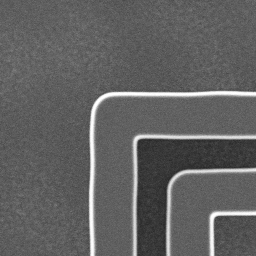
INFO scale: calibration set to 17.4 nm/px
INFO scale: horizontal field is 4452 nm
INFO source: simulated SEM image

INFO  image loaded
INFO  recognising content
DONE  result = groups of lines, slits or small figures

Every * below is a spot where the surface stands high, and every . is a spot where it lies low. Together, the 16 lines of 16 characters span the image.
................
................
................
................
................
................
......**********
......**********
......**********
......**........
......**........
......**...*****
......**...*****
......**..****..
......**..***...
......**..***...